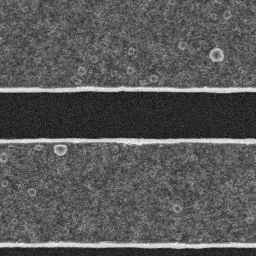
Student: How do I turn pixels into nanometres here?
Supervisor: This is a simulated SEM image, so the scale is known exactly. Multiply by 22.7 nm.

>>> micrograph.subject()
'one or a few lines or trenches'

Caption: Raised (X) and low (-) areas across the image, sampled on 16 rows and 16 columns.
XXXXXXXXXXXXXXXX
XXXXXXXXXXXXXXXX
XXXXXXXXXXXXXXXX
XXXXXXXXXXXXXXXX
XXXXXXXXXXXXXXXX
XXXXXXXXXXXXXXXX
----------------
----------------
----------------
XXXXXXXXXXXXXXXX
XXXXXXXXXXXXXXXX
XXXXXXXXXXXXXXXX
XXXXXXXXXXXXXXXX
XXXXXXXXXXXXXXXX
XXXXXXXXXXXXXXXX
----------------